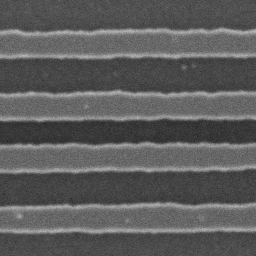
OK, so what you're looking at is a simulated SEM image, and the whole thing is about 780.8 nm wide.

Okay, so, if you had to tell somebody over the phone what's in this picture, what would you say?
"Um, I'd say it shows lines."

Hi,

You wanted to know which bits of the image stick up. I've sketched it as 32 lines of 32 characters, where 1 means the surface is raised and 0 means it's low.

00000000000000000000000000000000
00000000000000000000000000000000
00000000000000000000000000000000
00000000000000000000000000000000
11111111111111111111111111111111
11111111111111111111111111111111
11111111111111111111111111111111
00000000000000000000000000000000
00000000000000000000000000000000
00000000000000000000000000000000
00000000000000000000000000000000
00000000000000110000000000000010
11111111111111111111111111111111
11111111111111111111111111111111
11111111111111111111111111111111
00000000000000000000000000000000
00000000000000000000000000000000
00000000000000000000000000000000
11111111111111111111111111111111
11111111111111111111111111111111
11111111111111111111111111111111
11111110010000000000000000000000
00000000000000000000000000000000
00000000000000000000000000000000
00000000000000000000000000000000
00000000000000000001110000000001
11111111111111111111111111111111
11111111111111111111111111111111
11111111111111111111111111111111
00000000000000000000000000000000
00000000000000000000000000000000
00000000000000000000000000000000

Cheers